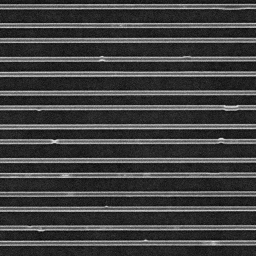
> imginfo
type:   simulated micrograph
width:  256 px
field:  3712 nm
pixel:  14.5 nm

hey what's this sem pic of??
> parallel lines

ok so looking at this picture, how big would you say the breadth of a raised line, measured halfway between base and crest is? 67.1 nanometres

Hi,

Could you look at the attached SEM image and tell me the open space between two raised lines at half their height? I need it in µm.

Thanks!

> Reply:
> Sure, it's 0.184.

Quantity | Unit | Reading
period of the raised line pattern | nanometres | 245